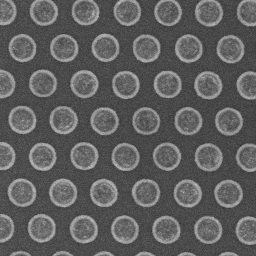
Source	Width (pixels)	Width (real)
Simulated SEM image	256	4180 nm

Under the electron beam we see a regular array of raised bodies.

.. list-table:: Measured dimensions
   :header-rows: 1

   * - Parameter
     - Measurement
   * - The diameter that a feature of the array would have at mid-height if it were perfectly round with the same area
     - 415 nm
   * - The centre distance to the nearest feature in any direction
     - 669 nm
